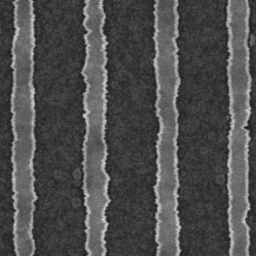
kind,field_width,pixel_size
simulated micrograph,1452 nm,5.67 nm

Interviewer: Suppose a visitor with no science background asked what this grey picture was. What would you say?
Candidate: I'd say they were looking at one or a few lines or trenches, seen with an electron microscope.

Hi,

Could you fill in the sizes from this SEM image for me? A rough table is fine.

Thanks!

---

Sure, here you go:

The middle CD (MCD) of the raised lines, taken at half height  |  104 nanometers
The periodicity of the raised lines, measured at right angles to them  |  406 nm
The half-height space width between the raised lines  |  299 nanometers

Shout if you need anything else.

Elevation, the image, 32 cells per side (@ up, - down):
--@@-------@@------@@@-------@@-
--@@-------@@------@@@-------@@-
--@@-------@@-------@@-------@@-
--@@-------@@------@@@-------@@-
--@@-------@@------@@@-------@@-
--@@-------@@-------@@-------@@-
--@@-------@@-------@@-------@@-
--@@-------@@------@@@-------@@-
--@@------@@@------@@@-------@@-
--@@------@@@-------@@-------@@-
--@@-------@@-------@@-------@@-
--@@-------@@-------@@-------@@-
--@@-------@@-------@@-------@@-
--@@-------@@-------@@-------@@-
--@@-------@@-------@@-------@@-
--@@-------@@-------@@-------@@-
--@@-------@@-------@@-------@@-
--@@-------@@-------@@-------@@-
--@@-------@@-------@@-------@@-
--@@-------@@-------@@-------@@-
--@@-------@@-------@@-------@@-
--@@-------@@-------@@-------@@-
--@@-------@@-------@@-------@@-
--@@-------@@------@@@-------@@-
--@@-------@@-------@@-------@@-
--@@-------@@-------@@-------@@-
--@@-------@@-------@@-------@@-
--@@-------@@-------@@-------@@-
--@@-------@@-------@@-------@@-
--@@-------@@-------@@-------@@-
--@@-------@@-------@@-------@@-
--@@-------@@-------@@-------@@-